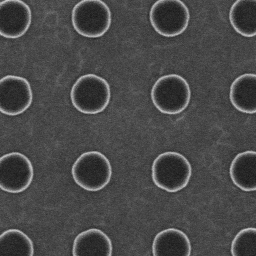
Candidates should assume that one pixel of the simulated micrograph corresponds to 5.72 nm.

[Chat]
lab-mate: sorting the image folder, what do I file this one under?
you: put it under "raised bodies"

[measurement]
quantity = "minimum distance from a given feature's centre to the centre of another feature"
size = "442 nm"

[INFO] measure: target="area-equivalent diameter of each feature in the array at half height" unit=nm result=223